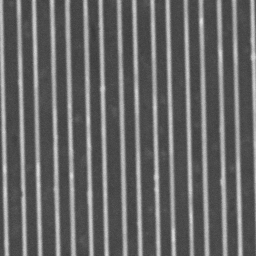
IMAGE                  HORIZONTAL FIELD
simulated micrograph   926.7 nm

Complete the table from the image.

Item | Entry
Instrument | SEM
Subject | parallel lines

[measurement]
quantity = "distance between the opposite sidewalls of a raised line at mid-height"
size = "9.9 nanometers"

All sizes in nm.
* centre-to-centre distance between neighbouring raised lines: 60.3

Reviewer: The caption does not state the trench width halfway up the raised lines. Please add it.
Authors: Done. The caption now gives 52.4 nm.